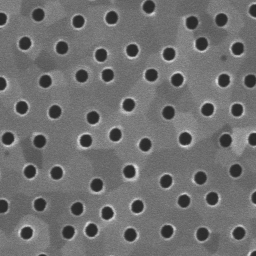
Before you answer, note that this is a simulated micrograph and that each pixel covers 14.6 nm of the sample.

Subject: a regular array of holes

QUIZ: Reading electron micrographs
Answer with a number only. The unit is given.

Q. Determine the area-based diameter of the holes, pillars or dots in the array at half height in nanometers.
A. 195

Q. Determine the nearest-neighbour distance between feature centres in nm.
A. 435